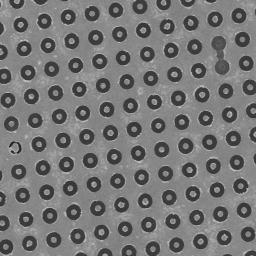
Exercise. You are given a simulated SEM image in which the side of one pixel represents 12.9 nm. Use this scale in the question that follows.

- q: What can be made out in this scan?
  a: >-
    a regular array of ring-shaped grooves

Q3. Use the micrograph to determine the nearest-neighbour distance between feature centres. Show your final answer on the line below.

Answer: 308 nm